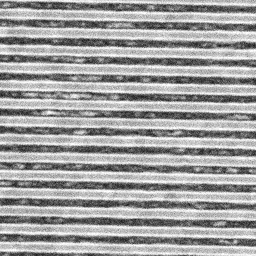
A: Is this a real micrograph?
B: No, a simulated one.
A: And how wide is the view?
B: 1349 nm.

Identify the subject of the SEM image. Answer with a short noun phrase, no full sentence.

parallel lines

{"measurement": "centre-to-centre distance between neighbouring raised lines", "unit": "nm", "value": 94.2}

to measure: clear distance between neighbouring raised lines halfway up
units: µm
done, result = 0.0507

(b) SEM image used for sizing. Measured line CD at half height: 40.8 nanometres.